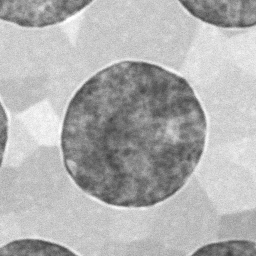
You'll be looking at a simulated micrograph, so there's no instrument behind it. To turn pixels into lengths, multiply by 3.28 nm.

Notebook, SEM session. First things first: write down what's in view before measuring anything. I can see holes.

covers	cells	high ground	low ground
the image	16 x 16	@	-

-----@@@@@@@----
@--@@@@@@@@@@---
@@@@@@@@@@@@@@@@
@@@@@@@@@@@@@@@@
@@@@@@-----@@@@@
@@@@@-------@@@@
@@@@---------@@@
@@@@---------@@@
@@@@---------@@@
@@@@---------@@@
@@@@--------@@@@
@@@@@------@@@@@
@@@@@@----@@@@@@
@@@@@@@@@@@@@@@@
@@@@@@@@@@@@@@@@
----@@@@@@@@@---